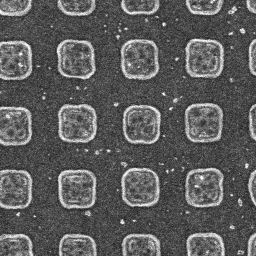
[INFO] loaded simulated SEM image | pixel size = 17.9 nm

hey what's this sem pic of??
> a regular array of raised bodies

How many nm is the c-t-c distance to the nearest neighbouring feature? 1140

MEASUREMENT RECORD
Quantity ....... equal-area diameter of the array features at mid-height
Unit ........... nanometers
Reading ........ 685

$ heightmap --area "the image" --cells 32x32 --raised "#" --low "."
####....####...#####....###....#
###.....###.....###......#......
................................
................................
................................
###.....###.....###.....###.....
#.##...####....####....#####...#
####...####....####.....####...#
####....####...#####....####...#
###......##......##.............
................................
................................
................................
........###.....###.....###.....
####....####....####...####....#
####....####....####...####....#
####....####....####....###.....
###.......#.....###.............
................................
................................
................................
.........##.....###.....###.....
####....####...#####...#####...#
####....####...#####...#####...#
####....####....####...#####...#
###.....###.....###.....###.....
................................
................................
................................
........................###.....
####....####....####....####...#
####....####....####....####...#